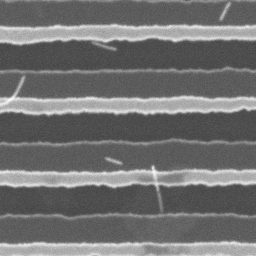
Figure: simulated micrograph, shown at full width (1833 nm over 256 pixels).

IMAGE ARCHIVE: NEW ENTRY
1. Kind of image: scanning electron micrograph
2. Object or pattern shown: lines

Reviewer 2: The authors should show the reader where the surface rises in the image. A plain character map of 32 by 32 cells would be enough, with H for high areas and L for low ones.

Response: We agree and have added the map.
HHHHHHHHHHHHHHHHHHHHHHHHHHHHHHHH
HHHHHHHHHHHHHHHHHHHHHHHHHHHHHHHH
HHHHHHHHHHHHHHHHHHHHHHHHHHHHHHHH
HHHHHHHHHHHHHHHHHHHHHHHHHHHHHHHH
HHHHHHHHHHHHHHHHHHHHHHHHHHHHHHHH
LLHLLLLLLLLLLLLLLLLLLLLLLLLLLLLL
LLLLLLLLLLLLLLLLLLLLLLLLLLLLLLLL
LLLLLLLLLLLLLLLLLLLLLLLLLLLLLLLL
LLLLLLLLLLLLLLLLLLLLLLLLLLLLLLLL
HHHHHHHHHHHHHHHHHHHHHHHHHHHHHHHH
HHHHHHHHHHHHHHHHHHHHHHHHHHHHHHHH
HHHHHHHHHHHHHHHHHHHHHHHHHHHHHHHH
HHHHHHHHHHHHHHHHHHHHHHHHHHHHHHHH
HHHHHHHHHHHHHHHHHHHHHHHHHHHHHHHH
LLLLLLLLLLLLLLLLLLLLLLLLLLLLLLLL
LLLLLLLLLLLLLLLLLLLLLLLLLLLLLLLL
LLLLLLLLLLLLLLLLLLLLLLLLLLLLLLLL
LLLLLLLLLLLLLLLLLLLLLHLLLLLLLLLL
HHHHHHHHHHHHHHHHHHHHHHHHHHHHHHHH
HHHHHHHHHHHHHHHHHHHHHHHHHHHHHHHH
HHHHHHHHHHHHHHHHHHHHHHHHHHHHHHHH
HHHHHHHHHHHHHHHHHHHHHHHHHHHHHHHH
HHHHHHHHHHHHHHHHHHHHHHHHHHHHHHHH
LLLLLLLLLLLLLLLLLLLLLLLLLLLLLLLL
LLLLLLLLLLLLLLLLLLLLLLLLLLLLLLLL
LLLLLLLLLLLLLLLLLLLLLLLLLLLLLLLL
LLLLLLLLLLLLLLLLLLLLLLLLLLLLLLLL
HHHHHHHHHHHHHHHHHHHHHHHHHHHHHHHH
HHHHHHHHHHHHHHHHHHHHHHHHHHHHHHHH
HHHHHHHHHHHHHHHHHHHHHHHHHHHHHHHH
HHHHHHHHHHHHHHHHHHHHHHHHHHHHHHHH
HHHHHHHHHHHHHHHHHHHHHHHHHHHHHHHH